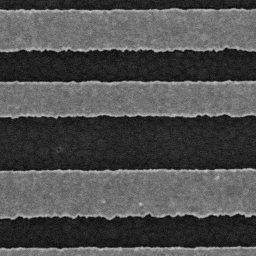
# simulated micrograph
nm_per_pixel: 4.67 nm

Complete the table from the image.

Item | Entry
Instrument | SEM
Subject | lines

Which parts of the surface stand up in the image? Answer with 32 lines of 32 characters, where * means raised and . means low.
................................
********************************
********************************
********************************
********************************
********************************
................................
................................
................................
................................
********************************
********************************
********************************
********************************
***.********..*.*....***..*..**.
................................
................................
................................
................................
................................
................................
********************************
********************************
********************************
********************************
********************************
********************************
................................
................................
................................
................................
********************************